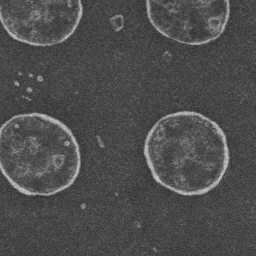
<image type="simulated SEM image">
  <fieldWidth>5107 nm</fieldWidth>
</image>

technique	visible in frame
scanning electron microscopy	raised bodies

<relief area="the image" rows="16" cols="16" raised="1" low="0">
1111100001111100
1111100000111100
0111000000011000
0000000000000000
0000000000000000
0000000000000000
0000000000000000
0110000000111000
1111000001111100
1111100001111100
1111100001111100
0111000000111000
0000000000000000
0000000000000000
0000000000000000
0000000000000000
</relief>